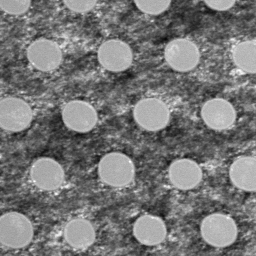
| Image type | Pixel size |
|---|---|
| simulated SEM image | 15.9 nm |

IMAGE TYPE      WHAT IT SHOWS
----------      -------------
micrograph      a regular array of raised bodies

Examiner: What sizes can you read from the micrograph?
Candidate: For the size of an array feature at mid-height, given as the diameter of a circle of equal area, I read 528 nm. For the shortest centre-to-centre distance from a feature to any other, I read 1050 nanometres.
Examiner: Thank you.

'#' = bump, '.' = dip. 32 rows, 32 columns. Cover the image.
####....####.....####.....###...
.##...............##............
................................
................................
................................
....###......###.....###......##
....####....####.....####....###
....####....####.....####....###
.....##......###......##......##
................................
................................
................................
###...............##......##....
####....####.....####....####...
####....####.....####....####...
####....####.....####.....###...
..........#.....................
................................
................................
.............###................
....###.....#####....####....###
....####....#####....####....###
....####.....###.....####....###
.....##...............##......##
................................
................................
................................
####.....##......###.....####...
####....####.....####....#####..
####....####.....####....#####..
###......##.......##......###...
................................